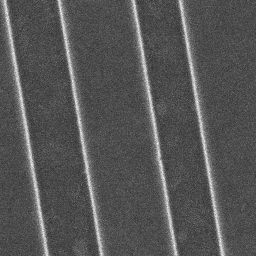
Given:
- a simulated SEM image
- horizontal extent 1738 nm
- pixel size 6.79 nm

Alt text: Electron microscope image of one or a few lines or trenches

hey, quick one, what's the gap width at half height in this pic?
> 328 nm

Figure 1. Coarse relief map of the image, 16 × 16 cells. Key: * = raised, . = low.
....****...*****
*...*****..*****
*...*****...****
*...*****...****
*...*****...****
*....****...****
*....****...****
**...*****..****
**...*****...***
**...*****...***
**...*****...***
**....****...***
**....****...***
***...*****..***
***...*****...**
***...*****...**